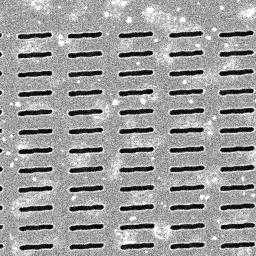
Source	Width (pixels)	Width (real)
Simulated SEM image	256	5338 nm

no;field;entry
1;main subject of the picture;a regular array of holes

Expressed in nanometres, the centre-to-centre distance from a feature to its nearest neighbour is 395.